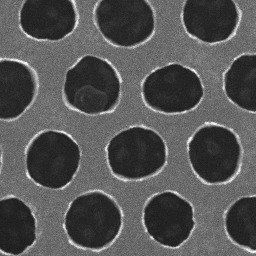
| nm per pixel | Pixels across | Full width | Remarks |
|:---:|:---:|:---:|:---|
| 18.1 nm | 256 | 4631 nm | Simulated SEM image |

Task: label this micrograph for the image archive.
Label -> holes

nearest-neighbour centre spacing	1330	nm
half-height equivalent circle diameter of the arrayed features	0.986	microns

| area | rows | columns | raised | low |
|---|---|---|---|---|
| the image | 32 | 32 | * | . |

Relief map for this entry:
***......***......*****......***
***......***.......****.......**
***......***.......****.......**
***......***.......****......***
****....*****......*****.....***
**************...***************
********************************
**********...****************...
...******.....******...******...
....****.......****......***....
....****.......***.......***....
....****.......***.......***....
....*****......***.......****...
...*******....*****.....******..
..******************************
********************************
******.********....******....***
****.....*****......****......**
****......***........***......**
***.......***........***......**
***.......****......****......**
****.....*****.....******....***
****.....*****************..****
******.*************************
**********...*******..**********
...******.....*****.....*****...
....****.......***......*****...
....****.......***......****....
....****.......***......****....
....*****.....*****.....*****...
....******...*******...*******..
*..*****************************